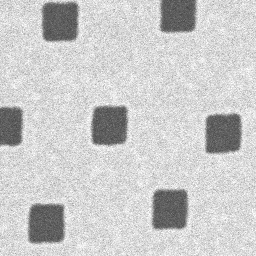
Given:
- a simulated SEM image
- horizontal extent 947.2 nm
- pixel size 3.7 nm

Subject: holes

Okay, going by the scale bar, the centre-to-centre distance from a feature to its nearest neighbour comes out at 103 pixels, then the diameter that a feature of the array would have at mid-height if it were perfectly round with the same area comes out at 153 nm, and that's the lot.